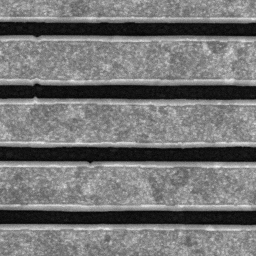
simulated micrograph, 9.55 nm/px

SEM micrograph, one or a few lines or trenches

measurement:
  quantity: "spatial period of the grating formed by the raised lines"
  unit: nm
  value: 600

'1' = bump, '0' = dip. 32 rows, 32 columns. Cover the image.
11111111111111111111111111111111
11111111111111111111111111111111
00000000000000000001111111111111
00000000000000000000000000000000
00000000000000000000000000000000
11111111111111111111111111111111
11111111111111111111111111111111
11111111111111111111111111111111
11111111111111111111111111111111
11111111111111111111111111111111
00000000000000000000000000000000
00000000000000000000000000000000
00000000000000000000000000000000
11111111111111111111111111111111
11111111111111111111111111111111
11111111111111111111111111111111
11111111111111111111111111111111
11111111111111111111111111111111
00000000000000000000000000000000
00000000000000000000000000000000
11111100000011111111100000000000
11111111111111111111111111111111
11111111111111111111111111111111
11111111111111111111111111111111
11111111111111111111111111111111
11111111111111111111111111111111
00000000000000000000000000000000
00000000000000000000000000000000
11111111111111111111111111111110
11111111111111111111111111111111
11111111111111111111111111111111
11111111111111111111111111111111